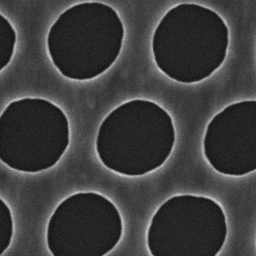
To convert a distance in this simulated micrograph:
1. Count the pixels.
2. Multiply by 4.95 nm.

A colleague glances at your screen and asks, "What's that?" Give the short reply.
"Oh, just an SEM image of holes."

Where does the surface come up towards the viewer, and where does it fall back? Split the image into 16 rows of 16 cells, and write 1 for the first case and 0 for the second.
1111000111100111
0110000011000011
0110000011000011
0110000111000011
1111001111000111
1111111111111111
1001111100111110
0000111000011000
0000110000011000
0000110000011000
1001111000111000
1111111111111111
1111000111100111
0110000111000011
0110000010000011
1110000110000011